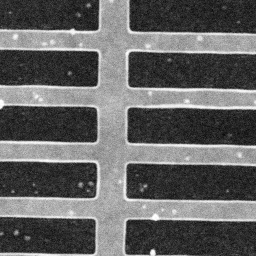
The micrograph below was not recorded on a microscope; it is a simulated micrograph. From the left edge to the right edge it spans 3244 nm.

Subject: groups of lines, slits or small figures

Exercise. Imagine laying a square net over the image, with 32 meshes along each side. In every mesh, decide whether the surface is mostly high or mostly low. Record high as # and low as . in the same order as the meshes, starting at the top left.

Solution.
............####................
............####................
............####................
............####................
################################
################################
............####....############
............####................
............####................
............####................
............####................
################################
################################
............####..........####.#
............####................
............####................
............####................
............####................
################################
################################
............####........########
............####................
............####................
............####................
............####................
################################
################################
............####.........#######
............####................
............####................
............###.................
............####................